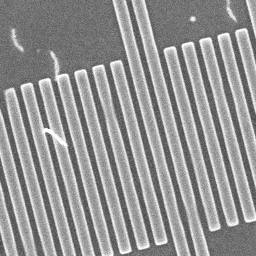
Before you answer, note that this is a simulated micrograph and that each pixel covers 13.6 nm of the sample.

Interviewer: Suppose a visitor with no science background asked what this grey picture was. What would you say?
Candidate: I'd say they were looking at groups of lines, slits or small figures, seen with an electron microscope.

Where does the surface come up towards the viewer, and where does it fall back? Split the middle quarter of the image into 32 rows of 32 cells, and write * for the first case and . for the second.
.........*..***..**..***..***..*
.......***..***..***..**..***..*
...***..**..***..***..***..**..*
*..***..***.***..***..***..***..
*..***..***..***.***..***..***..
**..**..***..***..***.***..***..
**..**...**..***..***..***.***..
**..***..**...**..***..***..***.
**..***..***..***..***.***..***.
***..**..***..***..***..***.***.
***..***..**..***..***..***.****
***..***..**...**..***..***..***
.**..***..***..***..**..***..***
.***..**...**..***..***..**..***
.***..***..**...**..***..***..**
.***..***..**...**..***..***..**
.***..***..***..***..**..***..**
..***.***..***..***..***..**..**
..***..***..**...**..***..***..*
..***..***..***..**..***..***..*
*..**..***..***..***..**..***..*
*..***..**..***..***..***..**...
*..***..***..**..***..***..***..
*..***..***..***..**..***..***..
**..**..***..***..***..**..***..
**..***..**..***..***..***..**..
**..***..***..**..***..***..***.
**..***..***..***..**..***..***.
***..**..***..***..***..***.***.
***..***..**..***..***..***..***
.**..***..***..**...**..***..***
.**..***..***..***..**..***..***